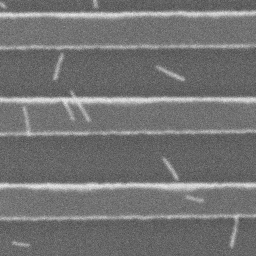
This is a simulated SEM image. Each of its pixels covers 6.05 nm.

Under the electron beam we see lines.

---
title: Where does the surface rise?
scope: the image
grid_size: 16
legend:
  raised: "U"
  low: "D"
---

DDDDDDDDDDDDDDDD
UUUUUUUUUUUUUUUU
UUUUUUUUUUUUUUUU
DDDDDDDDDDDDDDDD
DDDDDDDDDDDDDDDD
DDDDDDDDDDDDDDDD
UUUUUUUUUUUUUUUU
UUUUUUUUUUUUUUUU
DDDDDDDDDDDDDDDD
DDDDDDDDDDDDDDDD
DDDDDDDDDDDDDDDD
DDDDDDDDDDDDDUUD
UUUUUUUUUUUUUUUU
UUUUUUUUUUUUUUUU
DDDDDDDDDDDDDDDD
DDDDDDDDDDDDDDDD